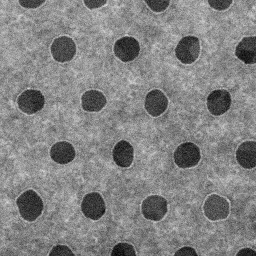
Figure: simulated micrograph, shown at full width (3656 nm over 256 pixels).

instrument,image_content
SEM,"a regular array of raised bodies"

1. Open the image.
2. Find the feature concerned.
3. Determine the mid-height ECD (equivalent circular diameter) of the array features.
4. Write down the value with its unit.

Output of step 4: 400 nanometers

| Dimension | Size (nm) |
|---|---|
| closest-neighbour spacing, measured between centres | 857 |